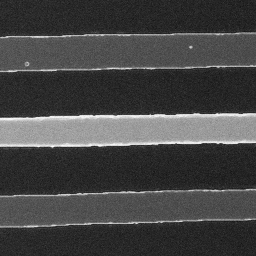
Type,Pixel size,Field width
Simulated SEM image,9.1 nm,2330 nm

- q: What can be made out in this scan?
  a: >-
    lines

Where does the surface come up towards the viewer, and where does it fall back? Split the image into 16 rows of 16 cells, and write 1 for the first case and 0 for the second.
0000000000000000
0000000000000000
1111111111111111
1111111111111111
0000000000000000
0000000000000000
0000000000000000
1111111111111111
1111111111111111
0000000000000000
0000000000000000
0000000000000000
1111111111111111
1111111111111111
0000000000000000
0000000000000000